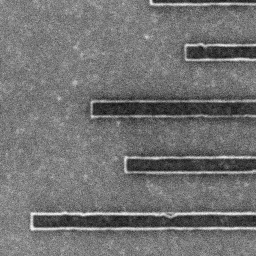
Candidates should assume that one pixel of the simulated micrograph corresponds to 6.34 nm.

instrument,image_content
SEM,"parallel lines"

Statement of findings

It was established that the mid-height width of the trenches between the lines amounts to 263 nanometers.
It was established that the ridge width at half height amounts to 94.2 nanometers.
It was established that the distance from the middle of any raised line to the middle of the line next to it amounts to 356 nm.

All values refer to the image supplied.